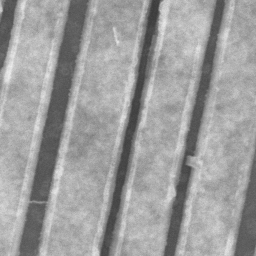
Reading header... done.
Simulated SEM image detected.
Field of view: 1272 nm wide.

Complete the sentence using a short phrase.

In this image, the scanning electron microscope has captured one or a few lines or trenches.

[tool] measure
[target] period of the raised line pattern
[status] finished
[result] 338 nm